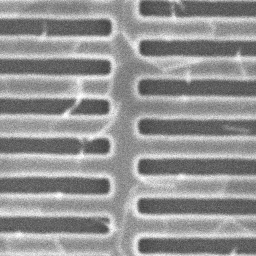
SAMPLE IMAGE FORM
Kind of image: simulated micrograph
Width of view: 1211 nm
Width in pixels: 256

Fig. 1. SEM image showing groups of lines, slits or small figures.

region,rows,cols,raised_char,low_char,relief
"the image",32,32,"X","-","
XXXXXXXXXXXXXXXXX---------------
XXXXXXXXXXXXXXXXX---------------
--------------XXXXXXXXXXXXXXXXXX
--------------XXXXXXXXXXXXXXXXXX
--------------XXXXXXXXXXXXXXXXXX
XXXXXXXXXXXXXXXXX---------------
XXXXXXXXXXXXXXXXX---------------
--------------XXXXXXXXXXXXXXXXXX
--------------XXXXXXXXXXXXXXXXXX
-------------XXXXXXXXXXXXXXXXXXX
XXXXXXXXXXXXXXXXX---------------
XXXXXXXXXXXXXXXXX---------------
--------------XXXXXXXXXXXXXXXXXX
--------------XXXXXXXXXXXXXXXXXX
XXXXX--XX----XXXXXXXXXXXXXXXXXXX
XXXXXXXXXXXXXXXXX---------------
XXXXXXXXXXXXXXXXX---------------
--------------XXXXXXXXXXXXXXXXXX
--------------XXXXXXXXXXXXXXXXXX
XXXXXXXX-XXXXXXXXXXXXXXXXXXXXXXX
XXXXXXXXXXXXXXXXX---------------
XXXXXXXXXXXXXXXXX---------------
--------------XXXXXXXXXXXXXXXXXX
--------------XXXXXXXXXXXXXXXXXX
XXXXXXXXX----XXXXXXXXXXXXXXXXXXX
XXXXXXXXXXXXXXXXX---------------
XXXXXXXXXXXXXXXXX---------------
--------------XXXXXXXXXXXXXXXXXX
--------------XXXXXXXXXXXXXXXXXX
XXXXXXXXXXXXXXXXXXXXXXXXXXXXXXXX
XXXXXXXXXXXXXXXXX---------------
XXXXXXXXXXXXXXXXX---------------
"